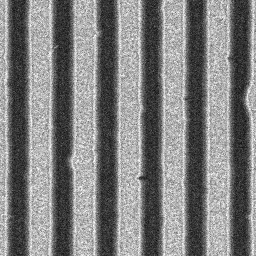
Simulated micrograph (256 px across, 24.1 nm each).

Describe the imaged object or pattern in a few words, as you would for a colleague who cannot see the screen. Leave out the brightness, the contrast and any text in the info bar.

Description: parallel lines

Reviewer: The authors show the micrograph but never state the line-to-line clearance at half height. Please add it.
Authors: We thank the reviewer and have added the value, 469 nanometres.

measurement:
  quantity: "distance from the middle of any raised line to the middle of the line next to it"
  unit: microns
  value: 1.07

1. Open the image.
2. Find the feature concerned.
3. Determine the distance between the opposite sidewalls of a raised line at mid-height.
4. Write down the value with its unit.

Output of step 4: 604 nanometres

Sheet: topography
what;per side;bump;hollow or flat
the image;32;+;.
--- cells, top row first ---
+...+++..+++...+++..+++...+++..+
+...+++..+++...+++..+++...+++..+
+...+++..+++...+++..+++...+++..+
+...+++..+++...+++..+++...+++..+
+...+++..+++...+++..+++...+++..+
+...+++..+++...+++..+++...+++..+
+...+++..+++...+++..+++...+++..+
+..++++..+++...+++..+++...+++..+
+...+++..+++...+++..+++...+++..+
+..++++..+++...+++..+++...+++..+
+...+++..+++...+++..+++...+++..+
+..++++..+++...+++..+++...+++..+
+..++++..+++...+++..+++...+++..+
+..++++..+++...+++..+++...+++..+
+...+++..+++...+++..+++...+++..+
+..++++..+++...+++..+++...+++..+
+..++++..+++...+++..+++...+++..+
+...+++..+++...+++..+++...+++..+
+...+++..+++...+++..+++...+++..+
+...+++..+++...+++..+++...+++..+
+...+++..+++...+++..+++...+++..+
+..++++..+++...+++..+++...+++..+
+..++++..+++...+++..+++...+++..+
+..++++..+++...+++..+++...+++..+
+..++++..+++...+++..+++...+++..+
+...+++..+++...+++..+++...+++..+
+...+++..+++...+++..+++...+++..+
+..++++..+++...+++..+++...+++..+
+..++++..+++...+++..+++...+++..+
+...+++..+++...+++..+++...+++..+
+..++++..+++...+++..+++...+++..+
+..++++..+++...+++..+++...+++..+